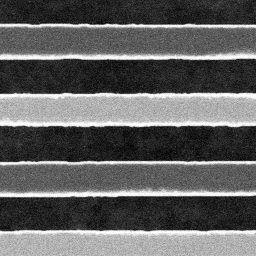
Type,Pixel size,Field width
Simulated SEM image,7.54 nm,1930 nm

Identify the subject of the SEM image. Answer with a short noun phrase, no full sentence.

lines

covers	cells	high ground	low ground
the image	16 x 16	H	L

LLLLLLLLLLLLLLLL
LLLLLLLLLLLLLLLL
HHHHHHHHHHHHHHHH
HHHHHHHHHHHHHHHH
LLLLLLLLLLLLLLLL
LLLLLLLLLLLLLLLL
HHHHHHHHHHHHHHHH
HHHHHHHHHHHHHHHH
LLLLLLLLLLLLLLLL
LLLLLLLLLLLLLLLL
HHHHHHHHHHHHHHHH
HHHHHHHHHHHHHHHH
LLLLLLLLLLLLLLLL
LLLLLLLLLLLLLLLL
LHHHHHHHHHHHHHHH
HHHHHHHHHHHHHHHH